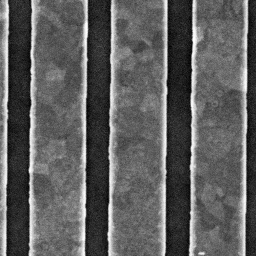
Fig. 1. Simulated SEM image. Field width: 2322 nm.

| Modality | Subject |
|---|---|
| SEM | lines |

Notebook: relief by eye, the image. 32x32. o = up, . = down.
o...ooooooo...ooooooo...ooooooo.
o...ooooooo...ooooooo...ooooooo.
o...ooooooo...ooooooo...ooooooo.
o...ooooooo...ooooooo...ooooooo.
o...ooooooo...ooooooo...ooooooo.
o...ooooooo...ooooooo...ooooooo.
o...ooooooo...ooooooo...ooooooo.
o...ooooooo...ooooooo...ooooooo.
o...ooooooo...ooooooo...ooooooo.
o...ooooooo...ooooooo...ooooooo.
o...ooooooo...ooooooo...ooooooo.
o...ooooooo...ooooooo...ooooooo.
o...ooooooo...ooooooo...ooooooo.
o...ooooooo...ooooooo...ooooooo.
o...ooooooo...ooooooo...ooooooo.
o...ooooooo...ooooooo...ooooooo.
o...ooooooo...ooooooo...ooooooo.
o...ooooooo...ooooooo...ooooooo.
o...ooooooo...ooooooo...ooooooo.
o...ooooooo...ooooooo...ooooooo.
o...ooooooo...ooooooo...ooooooo.
o...oooooo....ooooooo...ooooooo.
o...oooooo....ooooooo...ooooooo.
o...ooooooo...ooooooo...ooooooo.
o...ooooooo...oooooo....ooooooo.
o...ooooooo...oooooo....ooooooo.
o...oooooo....oooooo....oooooo..
....oooooo....oooooo....oooooo..
o...oooooo....oooooo....oooooo..
o...oooooo....oooooo....oooooo..
o...oooooo....oooooo....oooooo..
o...oooooo....oooooo....oooooo..